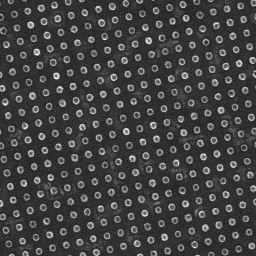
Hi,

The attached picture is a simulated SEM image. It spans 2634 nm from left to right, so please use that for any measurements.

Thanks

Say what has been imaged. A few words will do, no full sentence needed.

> a regular array of raised bodies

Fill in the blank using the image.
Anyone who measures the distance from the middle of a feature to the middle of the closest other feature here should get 141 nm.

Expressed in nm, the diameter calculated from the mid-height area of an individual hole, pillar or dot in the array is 59.8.